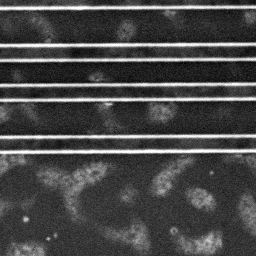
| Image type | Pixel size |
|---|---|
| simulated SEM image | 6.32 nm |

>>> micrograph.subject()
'parallel lines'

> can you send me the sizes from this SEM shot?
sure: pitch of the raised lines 45.8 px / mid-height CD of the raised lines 102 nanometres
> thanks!